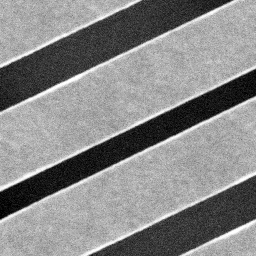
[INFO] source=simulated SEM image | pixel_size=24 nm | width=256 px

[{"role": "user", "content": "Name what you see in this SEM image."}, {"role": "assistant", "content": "lines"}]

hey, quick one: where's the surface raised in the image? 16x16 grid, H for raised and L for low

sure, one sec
HHHHHHHHLLLLLLHH
HHHHHHLLLLLLHHHH
HHHHLLLLLLHHHHHH
HHLLLLLHHHHHHHHH
LLLLLHHHHHHHHHHL
LLLHHHHHHHHHHLLL
LHHHHHHHHHHLLLLH
HHHHHHHHHLLLLHHH
HHHHHHHLLLLHHHHH
HHHHHLLLLHHHHHHH
HHHLLLLHHHHHHHHH
HLLLLHHHHHHHHHHL
LLLHHHHHHHHHHLLL
LHHHHHHHHHHLLLLL
HHHHHHHHHLLLLLHH
HHHHHHLLLLLLHHHH